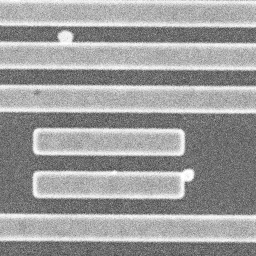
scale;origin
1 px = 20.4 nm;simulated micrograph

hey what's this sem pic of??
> groups of lines, slits or small figures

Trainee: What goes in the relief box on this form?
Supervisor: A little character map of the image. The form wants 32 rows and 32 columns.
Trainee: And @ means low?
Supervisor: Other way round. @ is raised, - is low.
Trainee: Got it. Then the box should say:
@@@@@@@@@@@@@@@@@@@@@@@@@@@@@@@@
@@@@@@@@@@@@@@@@@@@@@@@@@@@@@@@@
@@@@@@@@@@@@@@@@@@@@@@@@@@@@@@@@
--------------------------------
--------------------------------
@@@@@@@@@@@@@@@@----------------
@@@@@@@@@@@@@@@@@@@@@@@@@@@@@@@@
@@@@@@@@@@@@@@@@@@@@@@@@@@@@@@@@
@@@@@@@@@@@@@@@@@@@@@@@@@@@@@@@@
--------------------------------
--------------------------------
@@@@@@@@@@@@@@@@@@@@@@@@@@@@@@@@
@@@@@@@@@@@@@@@@@@@@@@@@@@@@@@@@
@@@@@@@@@@@@@@@@@@@@@@@@@@@@@@@@
--------------------------------
--------------------------------
----@@@@@@@@@@@@@@@@@@@---------
----@@@@@@@@@@@@@@@@@@@---------
----@@@@@@@@@@@@@@@@@@@---------
--------------------------------
--------------------------------
--------------------------------
----@@@@@@@@@@@@@@@@@@@---------
----@@@@@@@@@@@@@@@@@@@---------
-----@@@@@@@@@@@@@@@@@@---------
--------------------------------
--------------------------------
@@@@@@@@@@@@@@@@@@@@@@@@@@@@@@@@
@@@@@@@@@@@@@@@@@@@@@@@@@@@@@@@@
@@@@@@@@@@@@@@@@@@@@@@@@@@@@@@@@
--------------------------------
--------------------------------